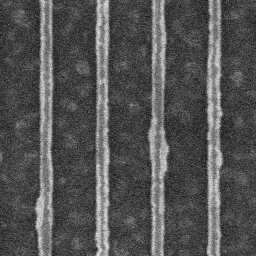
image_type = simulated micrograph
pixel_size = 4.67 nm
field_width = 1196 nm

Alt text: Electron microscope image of parallel lines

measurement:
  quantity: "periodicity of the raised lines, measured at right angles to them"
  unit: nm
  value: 262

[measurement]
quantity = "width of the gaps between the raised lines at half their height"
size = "209 nanometers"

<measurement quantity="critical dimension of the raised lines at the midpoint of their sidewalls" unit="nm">54.3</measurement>